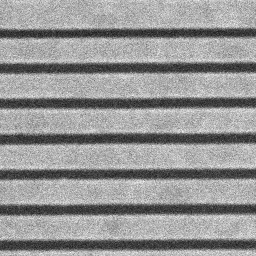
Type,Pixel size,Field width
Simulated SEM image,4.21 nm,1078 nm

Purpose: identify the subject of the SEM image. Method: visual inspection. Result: parallel lines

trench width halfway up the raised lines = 51.1 nanometers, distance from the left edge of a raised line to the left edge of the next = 149 nm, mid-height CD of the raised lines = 0.099 microns